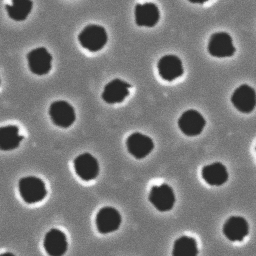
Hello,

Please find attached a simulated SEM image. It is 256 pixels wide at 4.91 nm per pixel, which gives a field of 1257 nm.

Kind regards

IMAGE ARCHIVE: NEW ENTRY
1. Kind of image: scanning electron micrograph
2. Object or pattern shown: a regular array of holes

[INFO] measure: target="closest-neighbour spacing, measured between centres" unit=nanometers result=282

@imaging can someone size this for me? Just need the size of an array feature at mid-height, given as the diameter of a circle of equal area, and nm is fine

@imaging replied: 125